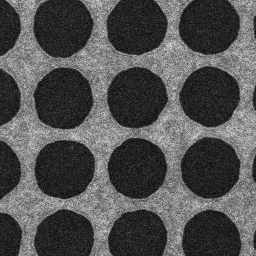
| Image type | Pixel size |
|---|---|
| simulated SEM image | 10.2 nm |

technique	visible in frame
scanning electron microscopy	holes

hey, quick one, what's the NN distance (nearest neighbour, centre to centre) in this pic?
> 721 nanometers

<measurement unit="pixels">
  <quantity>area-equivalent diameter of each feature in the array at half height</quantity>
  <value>60.4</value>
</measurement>